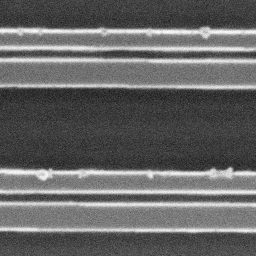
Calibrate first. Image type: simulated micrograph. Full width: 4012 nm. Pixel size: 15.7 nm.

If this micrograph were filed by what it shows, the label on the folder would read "lines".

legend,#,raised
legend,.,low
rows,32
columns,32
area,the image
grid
................................
................................
................................
.........................#......
################################
################################
################################
################################
################################
################################
################################
................................
................................
................................
................................
................................
................................
................................
................................
................................
................................
.....##...#...............###...
################################
################################
################################
################################
################################
################################
################################
................................
................................
................................